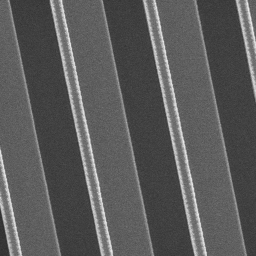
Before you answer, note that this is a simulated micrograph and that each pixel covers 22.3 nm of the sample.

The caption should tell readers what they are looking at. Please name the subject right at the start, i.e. lines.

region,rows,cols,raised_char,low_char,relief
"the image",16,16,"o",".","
o..ooo...ooo...o
o..oooo..oooo..o
o...ooo..oooo..o
o...ooo...ooo..o
o...ooo...ooo...
oo..ooo...ooo...
oo..oooo..ooo...
oo...ooo..oooo..
oo...ooo...ooo..
oo...ooo...ooo..
ooo..ooo...ooo..
ooo..oooo..oooo.
ooo...ooo..oooo.
ooo...ooo...ooo.
ooo...ooo...ooo.
.ooo..ooo...ooo.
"